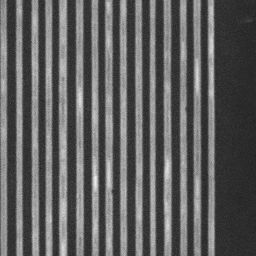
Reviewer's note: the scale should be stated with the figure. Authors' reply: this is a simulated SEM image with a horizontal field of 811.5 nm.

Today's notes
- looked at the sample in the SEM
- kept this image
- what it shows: parallel lines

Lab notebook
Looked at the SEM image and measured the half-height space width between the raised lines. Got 27.4 nanometres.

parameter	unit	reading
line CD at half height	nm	18.6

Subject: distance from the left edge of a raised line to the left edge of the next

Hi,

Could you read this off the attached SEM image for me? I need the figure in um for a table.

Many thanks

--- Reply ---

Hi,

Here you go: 0.0469